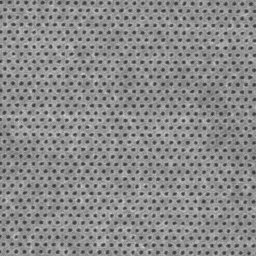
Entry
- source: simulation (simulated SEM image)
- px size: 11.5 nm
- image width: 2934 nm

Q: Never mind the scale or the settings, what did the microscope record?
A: a regular array of holes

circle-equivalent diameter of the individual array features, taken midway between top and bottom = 53.3 nanometres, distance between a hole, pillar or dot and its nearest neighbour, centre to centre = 90.9 nm